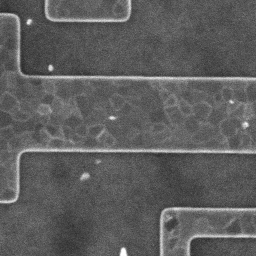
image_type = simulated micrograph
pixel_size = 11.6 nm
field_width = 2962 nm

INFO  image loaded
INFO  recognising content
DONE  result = wiring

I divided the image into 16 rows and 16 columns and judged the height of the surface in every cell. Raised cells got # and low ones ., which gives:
...#####........
#...............
#...............
#...............
#...............
################
################
################
################
##..............
#...............
#...............
#...............
..........######
..........######
..........##....